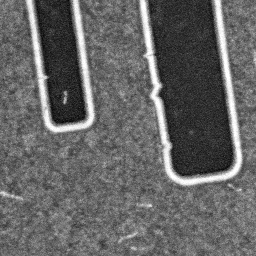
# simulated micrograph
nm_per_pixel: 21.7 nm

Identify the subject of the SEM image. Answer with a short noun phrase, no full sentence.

one or a few lines or trenches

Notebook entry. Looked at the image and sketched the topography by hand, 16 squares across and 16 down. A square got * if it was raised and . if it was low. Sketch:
**...****.....**
**...****.....**
**...****.....**
**...****.....**
***..*****....**
***...****....**
***...****.....*
***...****.....*
**********.....*
**********.....*
***********....*
****************
****************
****************
****************
****************